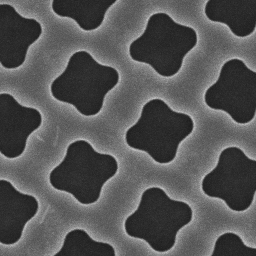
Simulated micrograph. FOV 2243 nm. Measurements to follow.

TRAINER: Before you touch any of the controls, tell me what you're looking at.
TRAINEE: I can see holes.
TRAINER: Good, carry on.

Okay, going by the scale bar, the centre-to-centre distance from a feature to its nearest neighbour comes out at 759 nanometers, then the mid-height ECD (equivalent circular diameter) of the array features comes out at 515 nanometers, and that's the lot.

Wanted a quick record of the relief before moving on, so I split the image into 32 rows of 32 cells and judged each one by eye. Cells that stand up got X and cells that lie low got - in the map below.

XXXXXXX-------XXXXXXXXXXXX------
--XXXXX------XXXXXXXXXXXXX------
----XXXXX----XXXXXX---XXXX------
-----XXXXX--XXXXXX------XXXXX---
-----XXXXXXXXXXXXX-------XXXXX-X
----XXXXXXXXXXXX--------XXXXXXXX
---XXXXXXX-XXXXX--------XXXXXXXX
---XXXXXX---XXXXX------XXXXXX-XX
X-XXXXXX------XXXXX----XXXXX---X
XXXXXXX--------XXXXX--XXXXX-----
XXXXXX---------XXXXXXXXXXXX-----
XXXXXX--------XXXXXXXXXXXX------
--XXXXX------XXXXXX-XXXXXX------
----XXXXX----XXXXX---XXXXX------
-----XXXXXXXXXXXXX------XXXXX---
-----XXXXXXXXXXXX-------XXXXXXXX
----XXXXXXXXXXXX--------XXXXXXXX
---XXXXXXXXXXXXX-------XXXXXXXXX
---XXXXX----XXXXX-----XXXXXX--XX
X-XXXXXX------XXXXX---XXXXX----X
XXXXXXX--------XXXXXXXXXXXX-----
XXXXXX---------XXXXXXXXXXX------
XXXXXX--------XXXXXXXXXXX-------
--XXXXX------XXXXXX-XXXXX-------
----XXXXX---XXXXXX---XXXXX------
-----XXXXXXXXXXXX------XXXXX---X
-----XXXXXXXXXXXX-------XXXXXXXX
----XXXXXXXXXXXX--------XXXXXXXX
---XXXXXXXXXXXXX-------XXXXXXXXX
---XXXXX---XXXXX------XXXXXX--XX
X-XXXXXX------XXXXX---XXXXX----X
XXXXXXX-------XXXXXXXXXXXXX-----